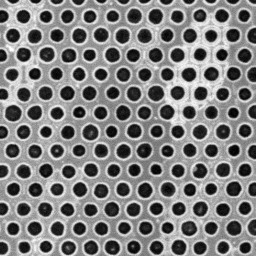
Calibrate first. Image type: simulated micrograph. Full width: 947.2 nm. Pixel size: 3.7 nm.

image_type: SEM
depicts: a regular array of holes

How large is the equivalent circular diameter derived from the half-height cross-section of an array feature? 53.5 nanometers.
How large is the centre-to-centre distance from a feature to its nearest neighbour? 0.0794 micrometres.